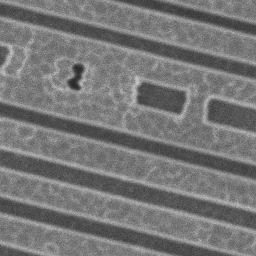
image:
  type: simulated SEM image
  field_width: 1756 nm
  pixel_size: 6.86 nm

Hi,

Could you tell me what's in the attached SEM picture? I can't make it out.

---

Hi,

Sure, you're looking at parallel lines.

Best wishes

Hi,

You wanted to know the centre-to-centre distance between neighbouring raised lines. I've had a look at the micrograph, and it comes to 324 nanometers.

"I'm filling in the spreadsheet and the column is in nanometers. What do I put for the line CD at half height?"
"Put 184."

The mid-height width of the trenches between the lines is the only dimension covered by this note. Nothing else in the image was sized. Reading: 112 nanometers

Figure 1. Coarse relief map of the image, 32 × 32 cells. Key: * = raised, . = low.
..*************.......**********
......*************.......******
*.........*************.......**
*****.........*************.....
**********........*************.
**************........**********
.*****************........******
.********************.........**
*********.***************.......
*********.********************..
********..*******...************
*****************......*********
*****************......***..****
...***************.....***......
.......*******************......
***.........***************.....
*******.........***************.
***********........*************
***************.........********
....***************.........****
........***************.........
**..........***************.....
******..........***************.
**********..........************
**************..........********
....**************..........****
........**************..........
***.........**************......
*******.........**************..
***********.........************
.**************.........********
....***************.........****